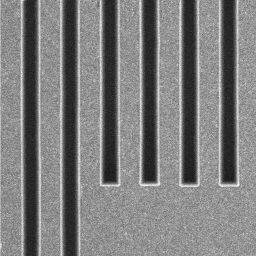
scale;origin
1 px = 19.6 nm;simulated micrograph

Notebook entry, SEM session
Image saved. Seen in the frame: parallel lines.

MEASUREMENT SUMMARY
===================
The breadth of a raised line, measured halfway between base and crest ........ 496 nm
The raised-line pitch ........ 775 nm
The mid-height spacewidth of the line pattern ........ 264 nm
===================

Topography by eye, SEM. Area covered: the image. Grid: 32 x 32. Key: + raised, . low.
+++..+++..+++..+++..+++..+++.+++
+++..+++..+++..+++..+++..+++.+++
+++..+++..+++..+++..+++..+++.+++
+++..+++..+++..+++..+++..+++.+++
+++..+++..+++..+++..+++..+++..++
+++..+++..+++..+++..+++..+++..++
+++..+++..+++..+++..+++..+++..++
+++..+++..+++..+++..+++..+++..++
+++..+++..+++..+++..+++..+++..++
+++..+++..+++..+++..+++..+++..++
+++..+++..+++..+++..+++..+++.+++
+++..+++..+++..+++..+++..+++.+++
+++..+++..+++..+++..+++..+++.+++
+++..+++..+++..+++..+++..+++.+++
+++..+++..+++..+++..+++..+++..++
+++..+++..+++..+++..+++..+++..++
+++..+++..+++..+++..+++..+++..++
+++..+++..+++..+++..+++..+++..++
+++..+++..+++..+++..+++..+++..++
+++..+++..+++..+++..+++..+++..++
+++..+++..+++..+++..+++..+++..++
+++..+++..+++..+++..+++..+++..++
+++..+++..+++..+++..+++..+++..++
+++..+++..++++++++++++++++++++++
+++..+++..++++++++++++++++++++++
+++..+++..++++++++++++++++++++++
+++..+++..++++++++++++++++++++++
+++..+++..++++++++++++++++++++++
+++..+++..++++++++++++++++++++++
+++..+++..++++++++++++++++++++++
+++..+++..++++++++++++++++++++++
+++..+++..++++++++++++++++++++++